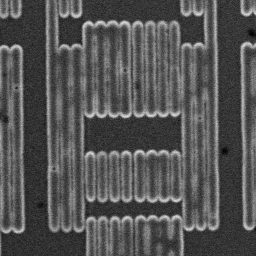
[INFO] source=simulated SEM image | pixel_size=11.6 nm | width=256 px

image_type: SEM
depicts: wiring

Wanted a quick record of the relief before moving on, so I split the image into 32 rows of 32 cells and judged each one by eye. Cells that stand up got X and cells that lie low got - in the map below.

XX----XXXX-------------XXXX---XX
XX----XXXX-------------XXXX---XX
------X-------------------X-----
------X---XXXXXXXXXXXX----X-----
------X---XXXXXXXXXXXX----X-----
------X---XXXXXXXXXXXX---XX---X-
XXX---XXXXXXXXXXXXXXXXXXXXX---XX
XXX---XXXXXXXXXXXXXXXXXXXXX---XX
XXX---XXXXXXXXXXXXXXXXXXXXX---XX
XXX---XXXXXXXXXXXXXXXXXXXXX---XX
XXX---XXXXXXXXXXXXXXXXXXXXX---XX
XXX---XXXXXXXXXXXXXXXXXXXXX---XX
XXX---XXXXXXXXXXXXXXXXXXXXX---XX
XXX---XXXXXXXXXXXXXXXXXXXXX---XX
XXX---XXXXX-X-XX-X-----XXXX---XX
XXX---XXXX-------------XXXX---XX
XXX---XXXX-------------XXXX---XX
XXX---XXXX-------------XXXX---XX
XXX---XXXX-------------XXXX---XX
XXX---XXXXXXXXXXXXXXXXXXXXX---XX
XXX---XXXXXXXXXXXXXXXXXXXXX---XX
XXX---XXXXXXXXXXXXXXXXXXXXX---XX
XXX---XXXXXXXXXXXXXXXXXXXXX---XX
XXX---XXXXXXXXXXXXXXXXXXXXX---XX
XXX---XXXXXXXXXXXXXXXXXXXXX---XX
XXX---XXXX-------------XXXX---XX
XXX---XXXX-------------XXXX---XX
XXX---XXXXXXXXXXXXXXXXXXXXX---XX
XXX---X-XXXXXXXXXXXXXXXX--X----X
-----------XXXXXXXXXXXX---------
-----------XXXXXXXXXXXX---------
-----------XXXXXXXXXXXX---------